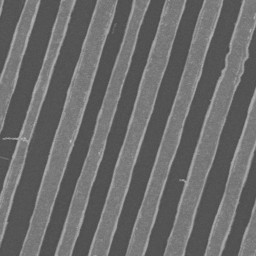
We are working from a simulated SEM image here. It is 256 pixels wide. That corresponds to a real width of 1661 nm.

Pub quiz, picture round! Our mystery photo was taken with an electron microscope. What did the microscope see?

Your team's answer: parallel lines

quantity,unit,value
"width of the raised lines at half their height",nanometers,109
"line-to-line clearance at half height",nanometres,126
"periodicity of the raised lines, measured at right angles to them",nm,229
